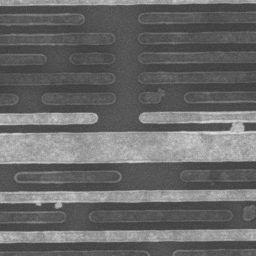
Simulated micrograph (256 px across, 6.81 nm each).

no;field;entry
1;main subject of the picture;groups of lines, slits or small figures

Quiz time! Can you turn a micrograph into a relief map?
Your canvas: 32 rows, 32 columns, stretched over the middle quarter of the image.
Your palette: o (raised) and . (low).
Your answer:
................................
................................
oooooooooooo.......ooooooooooooo
ooooooooooooo......ooooooooooooo
oooooooooooo.......ooooooooooooo
................................
................................
oooooooooooo.......ooooo......oo
ooooooooooooo......ooooo......oo
oooooooooooo........oooo.......o
................................
................................
oooooooo............oooooooooooo
oooooooo...........ooooooooooooo
oooooooo...........ooooooooooooo
................................
................................
oooooooooooooooooooooooooooooooo
oooooooooooooooooooooooooooooooo
oooooooooooooooooooooooooooooooo
oooooooooooooooooooooooooooooooo
oooooooooooooooooooooooooooooooo
oooooooooooooooooooooooooooooooo
oooooooooooooooooooooooooooooooo
oooooooooooooooooo..............
................................
................................
oooooooooooooo...............ooo
oooooooooooooo...............ooo
................................
................................
................................